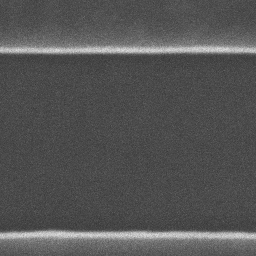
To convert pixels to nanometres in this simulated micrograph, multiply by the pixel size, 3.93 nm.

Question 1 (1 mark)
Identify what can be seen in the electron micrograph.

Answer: one or a few lines or trenches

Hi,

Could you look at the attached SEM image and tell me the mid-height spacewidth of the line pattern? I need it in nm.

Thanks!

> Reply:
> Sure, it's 717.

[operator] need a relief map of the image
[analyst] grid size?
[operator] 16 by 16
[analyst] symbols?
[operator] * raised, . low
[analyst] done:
****************
****************
****************
................
................
................
................
................
................
................
................
................
................
................
................
****************